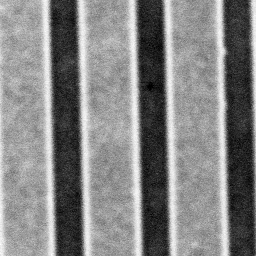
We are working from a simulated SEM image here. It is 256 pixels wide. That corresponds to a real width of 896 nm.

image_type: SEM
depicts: one or a few lines or trenches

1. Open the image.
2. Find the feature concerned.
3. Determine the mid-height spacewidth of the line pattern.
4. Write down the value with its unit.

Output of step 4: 123 nm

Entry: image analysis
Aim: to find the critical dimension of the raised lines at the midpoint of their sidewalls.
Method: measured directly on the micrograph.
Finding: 0.181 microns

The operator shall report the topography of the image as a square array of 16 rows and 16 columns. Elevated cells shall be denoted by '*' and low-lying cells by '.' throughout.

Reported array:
***..***..****..
***..***...***..
***..***...***..
***..***...***..
***..***...***..
***..***...***..
***..***...***..
***..***...***..
***..***...***..
***..****..***..
***..****..***..
***..****..***..
***..****..***..
***..****..***..
***..****..***..
***..****..***..